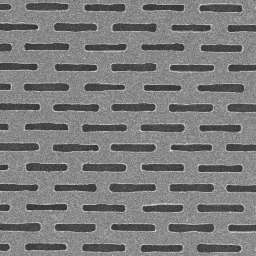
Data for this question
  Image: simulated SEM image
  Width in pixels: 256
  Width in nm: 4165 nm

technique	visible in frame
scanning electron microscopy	a regular array of holes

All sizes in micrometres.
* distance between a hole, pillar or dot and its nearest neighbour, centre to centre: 0.56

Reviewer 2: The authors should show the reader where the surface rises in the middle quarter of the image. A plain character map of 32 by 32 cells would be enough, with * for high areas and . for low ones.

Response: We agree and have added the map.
........****...........****.....
........****...........****.....
********************************
********************************
********************************
.****..........*****.........***
.****..........*****.........***
********************************
********************************
********************************
.........***...........***......
.........***...........***......
********************************
********************************
********************************
.****...........***...........**
.****...........***...........**
********************************
********************************
********************************
........****...........****.....
.........***...........****.....
********************************
********************************
********************************
.****...........***...........**
.****..........*****..........**
********************************
********************************
********************************
........***............***......
........***............***......